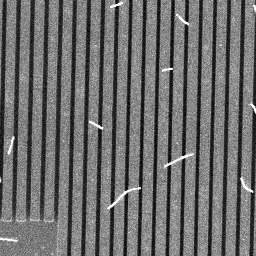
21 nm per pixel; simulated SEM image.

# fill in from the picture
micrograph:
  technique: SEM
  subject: parallel lines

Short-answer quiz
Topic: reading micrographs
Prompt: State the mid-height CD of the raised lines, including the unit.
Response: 0.2 micrometres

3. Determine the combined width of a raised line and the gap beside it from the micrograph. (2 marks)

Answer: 294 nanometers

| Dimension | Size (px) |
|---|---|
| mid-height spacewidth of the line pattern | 3.75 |